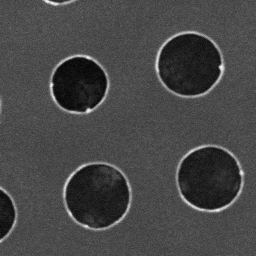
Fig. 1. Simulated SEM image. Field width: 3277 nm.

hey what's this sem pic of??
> holes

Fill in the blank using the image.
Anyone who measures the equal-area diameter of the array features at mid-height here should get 814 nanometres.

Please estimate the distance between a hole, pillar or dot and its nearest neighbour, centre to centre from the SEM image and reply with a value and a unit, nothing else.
1440 nanometers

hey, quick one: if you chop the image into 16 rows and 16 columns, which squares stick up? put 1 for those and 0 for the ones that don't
1111111111111111
1111111111111111
1111111111100111
1111111111000011
1110001111000011
1110000111100111
1111001111111111
1111111111111111
1111111111111111
1111111111110011
1111100111100001
1111000011100001
0111000011110001
0111100011111111
0111111111111111
1111111111111111